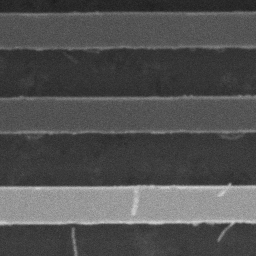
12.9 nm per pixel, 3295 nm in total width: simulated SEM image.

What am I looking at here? lines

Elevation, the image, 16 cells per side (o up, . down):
................
oooooooooooooooo
oooooooooooooooo
................
................
................
oooooooooooooooo
oooooooooooooooo
................
................
................
................
oooooooooooooooo
oooooooooooooooo
................
................